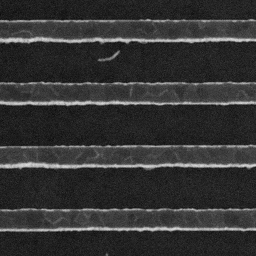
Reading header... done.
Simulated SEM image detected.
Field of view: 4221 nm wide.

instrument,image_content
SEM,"lines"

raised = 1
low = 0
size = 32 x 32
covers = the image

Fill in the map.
00000000000000000000000000000000
00000000000000000000000000000000
00000000000000000110100000000001
11111111111111111111111111111111
11111111111111111111111111111111
00000000000000000000000000000000
00000000000000000000000000000000
00000000000000000000000000000000
00000000000000000000000000000000
00000000000000000000000000000000
11111111111111111111111111111111
11111111111111111111111111111111
11111111111111111111111111111111
00000000000000000000000000000000
00000000000000000000000000000000
00000000000000000000000000000000
00000000000000000000000000000000
00000000000000000000000000000000
11111111111111111111111111111111
11111111111111111111111111111111
11111111111111111111111111111111
00000000000000000000000000000000
00000000000000000000000000000000
00000000000000000000000000000000
00000000000000000000000000000000
00000000000000000000000000000000
11111111111111111111111111111111
11111111111111111111111111111111
11111111111111111111111111111111
00000000000000000000000000000000
00000000000000000000000000000000
00000000000000000000000000000000